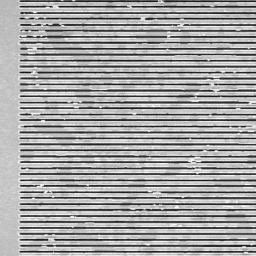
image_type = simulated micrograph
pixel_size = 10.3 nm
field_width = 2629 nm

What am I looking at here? parallel lines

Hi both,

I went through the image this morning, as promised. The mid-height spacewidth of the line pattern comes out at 0.0193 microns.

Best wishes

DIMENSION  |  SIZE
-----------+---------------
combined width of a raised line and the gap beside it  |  61.3 nm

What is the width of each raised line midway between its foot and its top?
0.0385 micrometres